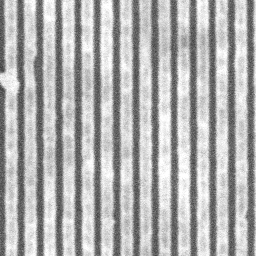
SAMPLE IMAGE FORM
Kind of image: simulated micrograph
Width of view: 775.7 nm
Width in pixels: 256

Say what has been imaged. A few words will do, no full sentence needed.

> parallel lines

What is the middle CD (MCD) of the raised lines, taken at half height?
9.77 pixels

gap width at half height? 26.9 nanometres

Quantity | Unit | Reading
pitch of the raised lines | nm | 58.1